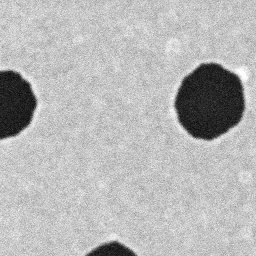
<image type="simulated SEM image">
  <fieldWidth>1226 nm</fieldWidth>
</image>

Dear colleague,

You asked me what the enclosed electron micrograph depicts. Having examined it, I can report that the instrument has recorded holes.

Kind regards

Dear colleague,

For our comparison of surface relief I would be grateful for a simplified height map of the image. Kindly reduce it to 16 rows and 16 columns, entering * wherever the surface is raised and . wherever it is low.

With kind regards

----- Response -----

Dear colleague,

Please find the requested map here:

****************
****************
****************
****************
.***********...*
..*********....*
..*********....*
..*********....*
.***********..**
****************
****************
****************
****************
****************
****************
******..********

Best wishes